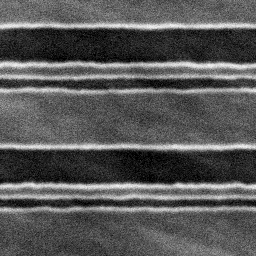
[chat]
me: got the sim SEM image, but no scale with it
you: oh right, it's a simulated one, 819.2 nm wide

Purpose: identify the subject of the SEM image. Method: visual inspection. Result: lines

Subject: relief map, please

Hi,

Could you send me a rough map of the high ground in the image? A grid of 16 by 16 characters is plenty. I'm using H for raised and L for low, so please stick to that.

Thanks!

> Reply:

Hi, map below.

HHHHHHHHHHHHHHHH
HHHHHHHHHHHHHHHH
LLLLLLLLLLLLLLLL
LLLLLLLLLLLLLLLL
HHHHHHHHHHHHHHHH
HHHHHHHHHHHHHHHH
HHHHHHHHHHHHHHHH
HHHHHHHHHHHHHHHH
HHHHHHHHHHHHHHHH
LLLLLLLLLLLLLLLL
LLLLLLLLLLLLLLLL
LLLLLLLLLLLLLLLL
HHHHHHHHHHHHHHHH
HHHHHHHHHHHHHHHH
HHHHHHHHHHHHHHHH
HHHHHHHHHHHHHHHH